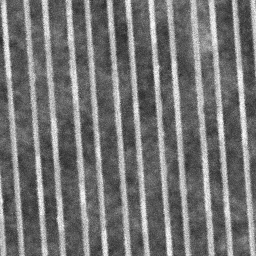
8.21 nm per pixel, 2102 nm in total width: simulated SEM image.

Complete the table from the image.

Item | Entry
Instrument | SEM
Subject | parallel lines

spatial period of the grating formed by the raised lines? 172 nanometres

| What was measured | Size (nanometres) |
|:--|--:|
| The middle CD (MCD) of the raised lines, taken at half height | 35.8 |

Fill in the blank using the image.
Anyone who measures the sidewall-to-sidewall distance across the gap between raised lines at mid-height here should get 150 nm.